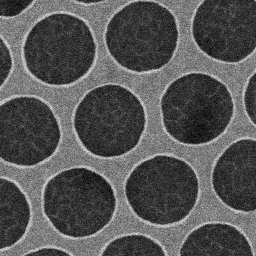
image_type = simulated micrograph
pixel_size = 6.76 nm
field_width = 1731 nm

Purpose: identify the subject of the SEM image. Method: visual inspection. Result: holes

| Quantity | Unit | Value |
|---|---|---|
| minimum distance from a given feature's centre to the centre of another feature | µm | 0.587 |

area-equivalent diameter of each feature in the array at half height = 495 nanometers